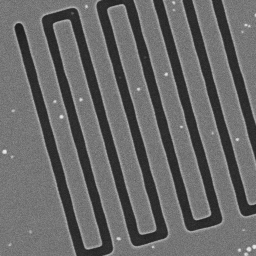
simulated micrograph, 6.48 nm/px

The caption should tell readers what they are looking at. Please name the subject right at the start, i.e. groups of lines, slits or small figures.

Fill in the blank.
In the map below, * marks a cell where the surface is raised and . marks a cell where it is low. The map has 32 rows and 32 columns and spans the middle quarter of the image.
*****..*****...*****..*****..***
*****...****...*****..*****...**
*****...*****..*****...****...**
.****...*****..*****...*****..**
.*****..*****...****...*****..**
.*****...****...*****..*****...*
..****...*****..*****...****...*
..*****..*****..*****...*****..*
..*****...****...*****..*****..*
..*****...*****..*****...****...
...****...*****..*****...*****..
...*****..*****...****...*****..
*..*****..*****...*****..*****..
*...****...*****..*****..*****..
*...*****..*****..*****...****..
*...*****..*****...****...*****.
**..*****...****...*****..*****.
**...****...*****..*****...****.
**...*****..*****...****...*****
***..*****..*****...*****..*****
***..*****...****...*****..*****
***...****...*****..*****...****
***...*****..*****...****...****
****..*****...****...*****..****
****...****...*****..*****...***
****...*****..*****..*****...***
*****..*****...****...****...***
*****..*****...*****..*****..***
.****...****...*****..*****...**
.****...*****..*****...****...**
.*****..*****..*****...*****..**
.*****..*****...****...*****..**